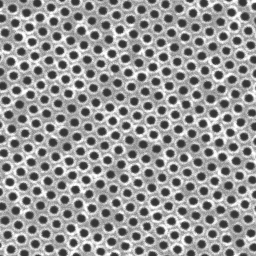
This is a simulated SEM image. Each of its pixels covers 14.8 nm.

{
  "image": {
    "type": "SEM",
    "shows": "a regular array of holes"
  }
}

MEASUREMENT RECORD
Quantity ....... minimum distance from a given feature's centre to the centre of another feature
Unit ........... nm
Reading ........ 211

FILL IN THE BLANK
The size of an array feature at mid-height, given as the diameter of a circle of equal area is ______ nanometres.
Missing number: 137